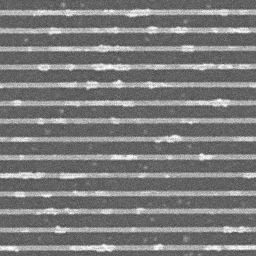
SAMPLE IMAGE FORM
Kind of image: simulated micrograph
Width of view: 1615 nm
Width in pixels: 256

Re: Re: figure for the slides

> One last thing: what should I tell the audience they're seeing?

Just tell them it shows parallel lines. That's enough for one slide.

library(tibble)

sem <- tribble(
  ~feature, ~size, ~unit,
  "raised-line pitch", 114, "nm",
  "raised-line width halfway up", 24.5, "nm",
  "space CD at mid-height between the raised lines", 91.5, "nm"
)